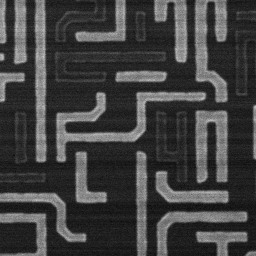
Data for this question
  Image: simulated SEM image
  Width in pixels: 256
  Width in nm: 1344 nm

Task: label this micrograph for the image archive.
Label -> wiring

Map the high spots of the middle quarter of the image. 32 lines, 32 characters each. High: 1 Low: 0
00000000000000000000000000000000
10000000000000000000000000000000
11111111110001111111111110000000
11111111110001111111111110000000
00000000000000000000000000000000
00000000000000000000000000000000
00000000000000000000000000000000
00000000110000000011111111111111
00000000110000000011111111111111
00000000110000000011000000000000
00000000110000000011000000000000
00000001110000000011000000000000
11111111100000000011000110001110
11111111000000000011000110001110
10000000000000000011000110001100
00000000000000000011000110001100
00000000000000000111000110001100
11111111111111111110000110001110
11111111111111111100000110001110
00000000000000000000000110001110
00000000000000000000000110001110
00000000000000000000000111001110
00011000000000000011000111111110
00011000000000000011000111111110
00011000000000000011000000001110
00011100000000000011000000001110
00011100000000000011000000001110
00011100000000000011000111001110
00011100000000000011100111001110
00011100000000000011100111000000
00011100000000000011100111000000
00011100000000000011100111100000